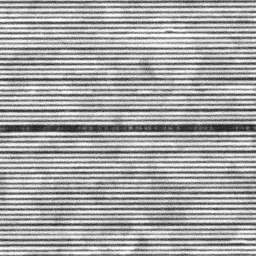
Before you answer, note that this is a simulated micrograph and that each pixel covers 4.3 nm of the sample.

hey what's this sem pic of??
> parallel lines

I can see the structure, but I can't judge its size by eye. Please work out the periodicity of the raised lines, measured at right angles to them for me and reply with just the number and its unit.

22.2 nm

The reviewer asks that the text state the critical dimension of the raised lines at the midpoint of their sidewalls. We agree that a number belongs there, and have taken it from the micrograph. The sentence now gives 9.1 nm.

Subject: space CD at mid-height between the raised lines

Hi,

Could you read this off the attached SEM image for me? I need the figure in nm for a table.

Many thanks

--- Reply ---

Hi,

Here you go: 11.8